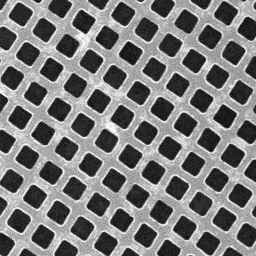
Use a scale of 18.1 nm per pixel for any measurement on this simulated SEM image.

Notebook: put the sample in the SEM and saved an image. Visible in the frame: a regular array of holes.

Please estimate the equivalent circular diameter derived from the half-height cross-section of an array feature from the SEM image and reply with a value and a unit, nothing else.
0.398 microns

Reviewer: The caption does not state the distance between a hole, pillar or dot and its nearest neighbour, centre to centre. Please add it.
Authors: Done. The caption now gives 28.2 pixels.